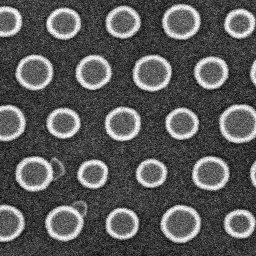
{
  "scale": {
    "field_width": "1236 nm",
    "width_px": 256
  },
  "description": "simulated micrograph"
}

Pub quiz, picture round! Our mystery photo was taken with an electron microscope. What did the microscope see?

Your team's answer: a regular array of raised bodies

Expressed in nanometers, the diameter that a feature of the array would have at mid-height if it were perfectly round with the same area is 146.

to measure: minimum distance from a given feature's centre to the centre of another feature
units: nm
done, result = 276